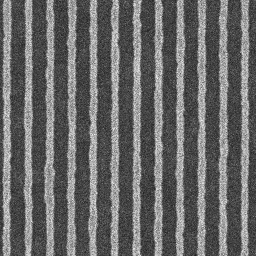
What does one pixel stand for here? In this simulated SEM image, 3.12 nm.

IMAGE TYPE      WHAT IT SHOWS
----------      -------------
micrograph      parallel lines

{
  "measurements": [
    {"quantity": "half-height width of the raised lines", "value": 0.0199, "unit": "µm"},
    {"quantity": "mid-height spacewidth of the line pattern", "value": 48.3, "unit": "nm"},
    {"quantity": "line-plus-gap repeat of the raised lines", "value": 67.5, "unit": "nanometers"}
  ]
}